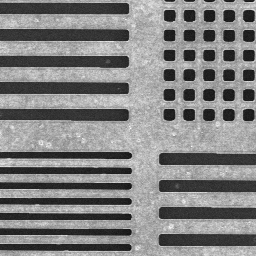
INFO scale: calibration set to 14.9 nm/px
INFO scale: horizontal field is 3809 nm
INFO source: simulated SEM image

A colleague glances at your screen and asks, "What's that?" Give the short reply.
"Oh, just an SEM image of groups of lines, slits or small figures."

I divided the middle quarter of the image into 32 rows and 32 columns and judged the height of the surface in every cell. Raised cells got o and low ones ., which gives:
................oooooooooooooooo
ooooooooooooooooooooooooo...oo..
ooooooooooooooooooooooooo...oo..
ooooooooooooooooooooooooo...oo..
...............ooooooooooooooooo
................oooooooooooooooo
................ooooooooo...oo..
................ooooooooo...oo..
ooooooooooooooooooooooooo...oo..
oooooooooooooooooooooooooooooooo
oooooooooooooooooooooooooooooooo
................ooooooooo..ooo..
................ooooooooo...oo..
................ooooooooo...oo..
oooooooooooooooooooooooooooooooo
oooooooooooooooooooooooooooooooo
oooooooooooooooooooooooooooooooo
oooooooooooooooooooooooooooooooo
oooooooooooooooooooooooooooooooo
oooooooooooooooooooooooooooooooo
oooooooooooooooooooooooooooooooo
oooooooooooooooooooooooooooooooo
.................ooooooo........
.................ooooooo........
oooooooooooooooooooooooo........
oooooooooooooooooooooooooooooooo
.................ooooooooooooooo
................oooooooooooooooo
oooooooooooooooooooooooooooooooo
oooooooooooooooooooooooo........
.................ooooooo........
oo..............oooooooo........